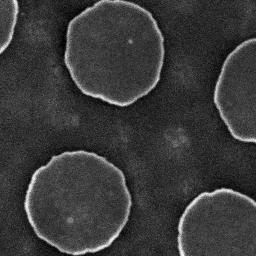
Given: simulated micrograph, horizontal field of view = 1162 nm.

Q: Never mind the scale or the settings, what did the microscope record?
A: raised bodies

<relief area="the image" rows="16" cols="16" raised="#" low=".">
#.....###.......
#...######......
#...######......
....######....##
....######....##
.....####.....##
.......#......##
..............##
...............#
................
...####.........
..######........
..######....####
..######...#####
..#####....#####
....##.....#####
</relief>